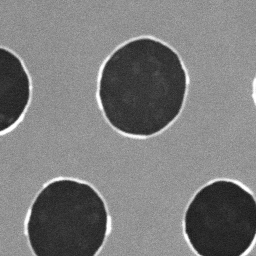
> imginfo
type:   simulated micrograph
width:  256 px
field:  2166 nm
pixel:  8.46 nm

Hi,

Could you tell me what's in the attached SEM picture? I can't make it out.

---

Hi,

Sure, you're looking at holes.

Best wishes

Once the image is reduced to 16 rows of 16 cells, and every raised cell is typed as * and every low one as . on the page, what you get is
****************
****************
********..******
.******....*****
..****......****
..****......****
..****.....*****
.******....*****
****************
****************
****************
***..********..*
**....******....
**.....*****....
**.....*****....
**....******....